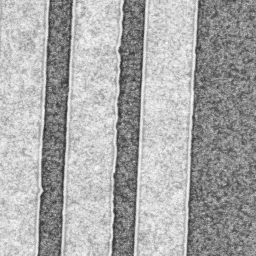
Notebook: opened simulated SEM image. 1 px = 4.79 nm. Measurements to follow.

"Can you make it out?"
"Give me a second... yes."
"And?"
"one or a few lines or trenches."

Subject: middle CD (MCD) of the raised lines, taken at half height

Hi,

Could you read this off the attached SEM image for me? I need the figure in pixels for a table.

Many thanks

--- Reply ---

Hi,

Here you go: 48.9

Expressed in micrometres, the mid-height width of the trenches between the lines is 0.122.